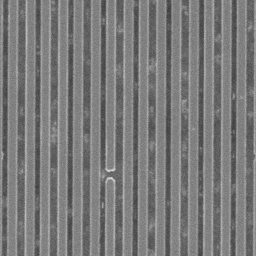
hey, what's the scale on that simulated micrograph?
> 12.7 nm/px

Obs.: parallel lines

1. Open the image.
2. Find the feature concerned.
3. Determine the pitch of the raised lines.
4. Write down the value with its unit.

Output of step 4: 0.208 microns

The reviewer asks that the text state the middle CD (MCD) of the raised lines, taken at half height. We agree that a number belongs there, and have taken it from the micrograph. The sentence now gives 113 nanometers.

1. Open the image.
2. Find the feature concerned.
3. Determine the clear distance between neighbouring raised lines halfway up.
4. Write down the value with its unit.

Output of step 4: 95.5 nm